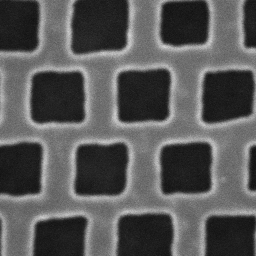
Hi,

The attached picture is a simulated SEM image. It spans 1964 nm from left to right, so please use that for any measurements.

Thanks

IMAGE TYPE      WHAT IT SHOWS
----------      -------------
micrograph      holes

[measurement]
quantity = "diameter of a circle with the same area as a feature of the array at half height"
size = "456 nm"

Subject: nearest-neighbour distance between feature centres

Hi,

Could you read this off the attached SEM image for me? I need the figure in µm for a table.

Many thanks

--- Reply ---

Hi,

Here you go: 0.645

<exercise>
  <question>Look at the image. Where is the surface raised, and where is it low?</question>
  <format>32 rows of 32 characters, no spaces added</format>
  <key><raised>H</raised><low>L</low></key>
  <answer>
LLLLLHHHHLLLLLLLHHHHLLLLLLHHHHLL
LLLLLHHHHLLLLLLLHHHHLLLLLLHHHHLL
LLLLLHHHHLLLLLLLHHHHLLLLLLHHHHLL
LLLLLHHHHLLLLLLLHHHHLLLLLLHHHHLL
LLLLLHHHHLLLLLLLHHHHLLLLLLHHHHLL
LLLLLHHHHLLLLLLLHHHHLLLLLLHHHHLL
HLLLHHHHHLLLLLLHHHHHHHHHHHHHHHHH
HHHHHHHHHHHHHHHHHHHHHHHHHHHHHHHH
HHHHHHHHHHHHHHHHHHHHLHHHHHHHHHHH
HHHHLLLLLLLHHHHLLLLLLHHHHHLLLLLL
HHHHLLLLLLLHHHHLLLLLLHHHHLLLLLLL
HHHHLLLLLLLHHHHLLLLLLHHHHLLLLLLL
HHHHLLLLLLLHHHHLLLLLLHHHHLLLLLLL
HHHHLLLLLLLHHHHLLLLLLHHHHLLLLLLL
HHHHLLLLLLLHHHHLLLLLLHHHHLLLLLLH
HHHHHHHHHHHHHHHHHHHHHHHHHHHHHHHH
HHHHHHHHHHHHHHHHHHHHHHHHHHHHHHHH
HHHHHHHHHHHHHHHHHHHHHHHHHHHHHHHH
LLLLLHHHHHLLLLLLHHHHLLLLLLLHHHHL
LLLLLHHHHLLLLLLLHHHHLLLLLLLHHHHL
LLLLLHHHHLLLLLLLHHHHLLLLLLLHHHHL
LLLLLHHHHLLLLLLLHHHHLLLLLLHHHHHL
LLLLLHHHHLLLLLLLHHHHLLLLLLHHHHHL
LLLLLHHHHLLLLLLLHHHHLLLLLLHHHHHL
HLLHHHHHHHLLHLHHHHHHHHHHHHHHHHHH
HHHHHHHHHHHHHHHHHHHHHHHHHHHHHHHH
HHHHHHHHHHHHHHHHHHHHHHHHHHHHHHHH
HHHHHLLLLLLHHHHLLLLLLLHHHHLLLLLL
HHHHLLLLLLLHHHHLLLLLLLHHHHLLLLLL
HHHHLLLLLLLHHHHLLLLLLLHHHHLLLLLL
HHHHLLLLLLLHHHHLLLLLLLHHHHLLLLLL
HHHHLLLLLLLHHHLLLLLLLLHHHLLLLLLL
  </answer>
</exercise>